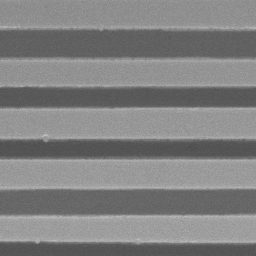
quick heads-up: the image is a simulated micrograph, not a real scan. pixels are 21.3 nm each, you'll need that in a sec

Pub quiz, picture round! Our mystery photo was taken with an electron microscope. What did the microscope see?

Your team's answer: lines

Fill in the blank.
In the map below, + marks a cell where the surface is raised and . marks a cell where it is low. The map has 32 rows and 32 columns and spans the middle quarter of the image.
++++++++++++++++++++++++++++++++
++++++++++++++++++++++++++++++++
++++++++++++++++++++++++++++++++
++++++++++++++++++++++++++++++++
++++++++++++++++++++++++++++++++
.+++++++.++++++.................
................................
................................
................................
................................
................................
++++++++++++++++++++++++++++++++
++++++++++++++++++++++++++++++++
++++++++++++++++++++++++++++++++
++++++++++++++++++++++++++++++++
++++++++++++++++++++++++++++++++
++++++++++++++++++++++++++++++++
++++++++++++++++++++++++++++++++
++++++++++++++++++++++++++++++++
................................
................................
................................
................................
................................
++++++++++++++++++++++++++++++++
++++++++++++++++++++++++++++++++
++++++++++++++++++++++++++++++++
++++++++++++++++++++++++++++++++
++++++++++++++++++++++++++++++++
++++++++++++++++++++++++++++++++
++++++++++++++++++++++++++++++++
................................